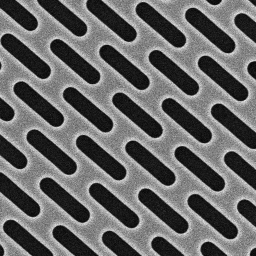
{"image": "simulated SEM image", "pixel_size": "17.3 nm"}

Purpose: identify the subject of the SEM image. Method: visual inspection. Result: groups of lines, slits or small figures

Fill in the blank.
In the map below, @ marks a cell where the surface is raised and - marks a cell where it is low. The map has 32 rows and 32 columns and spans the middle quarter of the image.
@------@@@@@------@@@@-------@@@
@@------@@@@@------@@@@@------@@
@@@------@@@@@------@@@@@------@
@@@@@----@@@@@@------@@@@@------
@@@@@@---@@@@@@@-----@@@@@@-----
@@@@@@@@@@@@@@@@@----@@@@@@@----
---@@@@@@@@@@@@@@@@-@@@@@@@@@---
----@@@@@@@@@--@@@@@@@@@@@@@@@--
------@@@@@@-----@@@@@@@@@-@@@@@
@------@@@@@-----@@@@@@@@---@@@@
@@------@@@@@------@@@@@------@@
@@@------@@@@@------@@@@@------@
@@@@------@@@@@------@@@@@------
@@@@@-------@@@@------@@@@@-----
@@@@@@------@@@@@------@@@@@----
@@@@@@@@----@@@@@@@-----@@@@@---
@@@@@@@@@---@@@@@@@------@@@@@--
@@@@@@@@@@@@@@@@@@@@@---@@@@@@@-
@@@----@@@@@@@@@@@@@@@-@@@@@@@@@
@@@-----@@@@@@@@---@@@@@@@@@@@@@
@@@------@@@@@@-----@@@@@@@@@-@@
@@@@------@@@@@------@@@@@@@---@
-@@@@------@@@@@------@@@@@@----
--@@@@------@@@@@------@@@@@----
---@@@@-------@@@@------@@@@@---
---@@@@@@------@@@@-------@@@@--
---@@@@@@@-----@@@@@-------@@@@-
--@@@@@@@@@-----@@@@@@------@@@@
@@@@@@@@@@@@---@@@@@@@@-----@@@@
@@@@@@@@@@@@@@@@@@@@@@@@----@@@@
@@@@@@@---@@@@@@@@@@@@@@@@@@@@@@
@@@@@@-----@@@@@@@@---@@@@@@@@@@